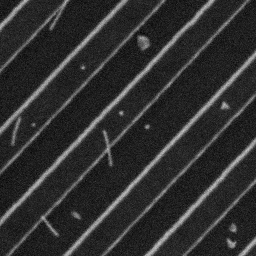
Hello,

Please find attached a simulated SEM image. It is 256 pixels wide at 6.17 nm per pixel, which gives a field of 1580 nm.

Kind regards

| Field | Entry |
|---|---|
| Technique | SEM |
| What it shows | lines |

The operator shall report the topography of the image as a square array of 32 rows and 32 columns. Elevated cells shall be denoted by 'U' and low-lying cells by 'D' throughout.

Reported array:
DDDUUUUUDDDDDDDUUUUUDDDDDDUUUUUD
DDUUUUUDDDDDDDUUUUUDDDDDDUUUUUDD
DUUUUUDDDDDDDUUUUUDDDDDDUUUUUDDD
UUUUUDDDDDDDUUUUUDDDDDDUUUUUDDDD
UUUUDDDDDDDUUUUUDDDDDDUUUUUDDDDD
UUUDDDDDDDUUUUUDDDDDDUUUUUDDDDDD
UUDDDDDDDUUUUUDDDDDDUUUUUDDDDDDD
UDDDDDDDUUUUUUDDDDDUUUUUDDDDDDDU
DDDDDDDUUUUUUDDDDDUUUUUDDDDDDDUU
DDDDDDUUUUUUDDDDDUUUUUDDDDDDDUUU
DDDDDDUUUUUDDDDDUUUUUDDDDDDDUUUU
DDDDDUUUUUDDDDDDUUUUDDDDDDDUUUUU
DDDDUUUUUDDDDDDUUUUDDDDDDDUUUUUU
DDDUUUUUDDDDDDUUUUDDDDDDDDUUUUUD
DDUUUUUDDDDDDUUUUUDDDDDDDUUUUUDD
DUUUUUDDDDDDUUUUUDDDDDDDUUUUUDDD
UUUUUDDDDDDUUUUUDDDDDDDUUUUUDDDD
UUUUDDDDDDUUUUUDDDDDDDUUUUUDDDDD
UUUDDDDDDUUUUUDDDDDDDUUUUUDDDDDU
UUDDDDDDUUUUUDDDDDDDUUUUUDDDDDUU
UDDDDDDUUUUUDDDDDDDUUUUUDDDDDUUU
DDDDDDUUUUUDDDDDDDUUUUUDDDDDUUUU
DDDDDUUUUUDDDDDDDUUUUUDDDDDUUUUU
DDDDUUUUUDDDDDDDUUUUUDDDDDUUUUUD
DDDUUUUUDDDDDDDUUUUUDDDDDUUUUUDD
DDUUUUUDDDDDDDUUUUUDDDDDUUUUUDDD
DUUUUUDDDDDDDUUUUUDDDDDDUUUUDDDD
UUUUUDDDDDDDUUUUUDDDDDDUUUUDDDDD
UUUUDDDDDDDUUUUUDDDDDDUUUUDDDDDD
UUUDDDDDDDUUUUUDDDDDDUUUUUDDDDDD
UUDDDDDDDDUUUUDDDDDDUUUUUDDDDDDU
UUDDDDDDDUUUUDDDDDDUUUUUDDDDDDUU